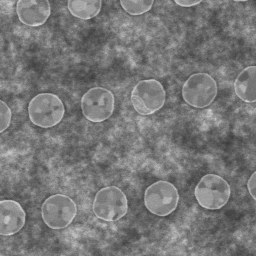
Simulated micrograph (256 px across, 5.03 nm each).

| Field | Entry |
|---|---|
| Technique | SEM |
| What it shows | a regular array of raised bodies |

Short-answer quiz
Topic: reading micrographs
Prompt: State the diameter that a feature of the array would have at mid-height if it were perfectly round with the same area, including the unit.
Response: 173 nm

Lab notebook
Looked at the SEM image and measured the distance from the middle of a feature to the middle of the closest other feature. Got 259 nanometres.